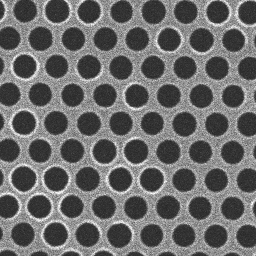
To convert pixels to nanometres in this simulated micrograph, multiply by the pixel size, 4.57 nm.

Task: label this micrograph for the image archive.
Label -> a regular array of holes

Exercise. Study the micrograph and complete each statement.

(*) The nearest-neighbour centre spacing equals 146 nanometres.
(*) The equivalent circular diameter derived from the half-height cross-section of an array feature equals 107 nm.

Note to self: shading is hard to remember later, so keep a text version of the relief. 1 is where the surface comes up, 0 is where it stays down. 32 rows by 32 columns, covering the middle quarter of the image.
01100000011000000110000001110000
01100000011000000110000001100000
11110000011100000111000001110000
11111001111110001111100011111001
11111111111111111111111111111111
00001111100011111000111110001111
00000111000001110000011100000111
00000110000001100000011000000110
00000110000001100000011000000110
00001111000001110000011100000111
10011111100111111000111110001111
11111111111111111111111111111111
11111000111110001111000011110000
01110000011100000111000001100000
01100000011000000110000001100000
01100000011000000110000001100000
11110000011100000111000011100000
11111000111110001111100111110000
11111111111111111111111111111111
00001111000011110000111110001111
00000111000001100000011100000111
00000110000001100000011000000110
00000110000001100000011000000110
00001111000001110000011100000111
10011111100011110000111110001111
11111111111111111111111111111111
11110000111100001111000011111001
01100000011100000110000001110000
01100000011000000110000001100000
01100000011000000110000001100000
01100000111100001110000011100000
11111001111110001111000111111000